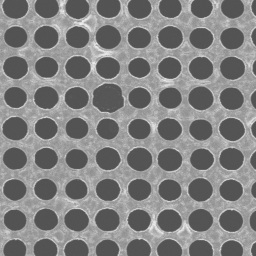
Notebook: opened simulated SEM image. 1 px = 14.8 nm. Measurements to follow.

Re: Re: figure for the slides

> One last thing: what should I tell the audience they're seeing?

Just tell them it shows a regular array of holes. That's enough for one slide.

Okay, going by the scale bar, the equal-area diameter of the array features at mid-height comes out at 23.1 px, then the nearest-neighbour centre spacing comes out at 445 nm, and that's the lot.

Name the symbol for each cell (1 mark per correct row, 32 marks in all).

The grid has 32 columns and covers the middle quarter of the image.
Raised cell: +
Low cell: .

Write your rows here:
.......+......++.....+++.....++.
.......+......++......+......++.
+.....+++.....+++....+++.....+++
++...+++++..+++++++++++++...++++
++++++++++++++++++++++++++++++++
+++++++++.....++++++++++++++++++
+....+++......+++....++++...++++
......+........+......++.....++.
......+........+......++.....++.
......+........+......++.....++.
+....++........++....++++....+++
+++++++++....+++++++++++++++++++
++++++++++++++++++++++++++++++++
++..++++++++++++++.+++++++++++++
+....++++....++++....+++.....+++
......++......++......+......++.
......++......++......+.......+.
+.....+++....+++.....+++.....++.
++...+++++...+++++..+++++...++++
++++++++++++++++++++++++++++++++
++++++++++++++++++++++++++++++++
++..+++++....++++....++++...++++
+.....++......++......++.....+++
......++......++......+.......++
......++......++......+.......++
+....++++....+++......++.....+++
++++++++++..++++++...++++...++++
++++++++++++++++++++++++++++++++
++++++++++++++++++++++++++++++++
+....++++....++++....+++....++++
+.....++......++......++.....++.
......++......++......++.....++.